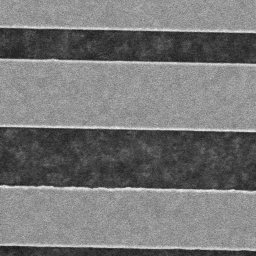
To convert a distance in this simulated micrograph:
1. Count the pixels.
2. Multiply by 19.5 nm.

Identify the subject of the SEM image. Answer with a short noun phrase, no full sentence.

one or a few lines or trenches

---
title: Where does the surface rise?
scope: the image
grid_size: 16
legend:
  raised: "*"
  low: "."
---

****************
****************
................
................
****************
****************
****************
****************
................
................
................
................
****************
****************
****************
..........******